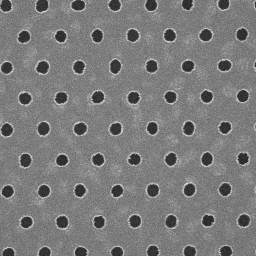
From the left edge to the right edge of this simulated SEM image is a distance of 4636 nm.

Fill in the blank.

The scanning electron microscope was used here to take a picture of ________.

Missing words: a regular array of holes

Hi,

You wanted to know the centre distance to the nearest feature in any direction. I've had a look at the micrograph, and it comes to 643 nanometers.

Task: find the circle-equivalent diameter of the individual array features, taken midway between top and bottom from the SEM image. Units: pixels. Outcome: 12.4